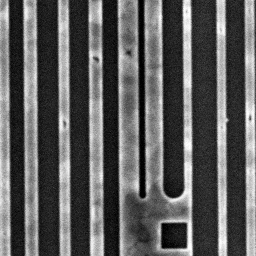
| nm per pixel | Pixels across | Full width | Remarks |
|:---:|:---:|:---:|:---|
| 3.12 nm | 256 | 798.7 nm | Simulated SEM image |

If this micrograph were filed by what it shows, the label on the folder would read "groups of lines, slits or small figures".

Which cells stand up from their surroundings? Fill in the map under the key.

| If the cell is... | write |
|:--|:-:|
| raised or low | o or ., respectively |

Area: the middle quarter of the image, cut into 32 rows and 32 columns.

o......oo.....oooo..oooo......oo
o......oo.....oo.o..oooo......oo
o......oo.....oooo..oooo......oo
o......oo.....oooo..oooo......oo
o......oo.....oooo..oooo......oo
o......oo.....oooo..oooo......oo
o......oo.....oooo..oooo......oo
o......oo.....oooo..oooo......oo
o......oo.....oooo..oooo......oo
o......oo.....oooo..oooo......oo
o......oo.....oooo..oooo......oo
o......oo.....oooo..oooo......oo
o......oo.....oooo..oooo......oo
o......oo.....oooo..oooo......oo
.......oo.....oooo..oooo......oo
.......oo.....oooo...ooo......oo
o......oo.....ooooo..ooo......oo
o......oo.....ooooo..ooo......oo
o......oo.....ooooo..ooo......oo
o......oo.....ooooo..ooo......oo
o......oo.....ooooo..ooo......oo
o......oo.....ooooo..ooo......oo
o......oo.....ooooo..ooo......oo
o......oo.....ooooo..ooo......oo
o......oo.....ooooo..ooo......oo
o......oo.....ooooo..ooo......oo
o......oo.....ooooo..ooo......oo
o......oo.....ooooo..ooo......oo
o......o......ooooo..ooo......oo
o......oo.....ooooo..ooo.......o
o......oo.....ooooo..ooo.......o
o......oo.....ooooo..oooo.....oo